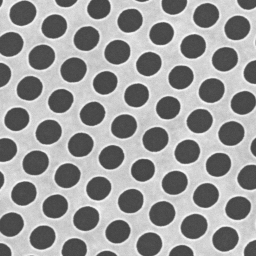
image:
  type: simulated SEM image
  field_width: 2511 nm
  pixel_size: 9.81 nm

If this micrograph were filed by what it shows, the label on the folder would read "a regular array of holes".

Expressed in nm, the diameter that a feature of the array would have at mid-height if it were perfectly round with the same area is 249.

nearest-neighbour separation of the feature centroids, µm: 0.326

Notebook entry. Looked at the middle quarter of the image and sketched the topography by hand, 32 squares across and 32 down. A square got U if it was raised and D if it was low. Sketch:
DDDDDDUUUUUUUUUUUUDDDDDDUUUUDDDU
DDDDDDUUUUUUUUUUUUDDDDDDUUUDDDDD
DDDDDDUUUDDDDUUUUUUDDDDUUUDDDDDD
DDDDDUUUDDDDDUUUUUUUUUUUUUDDDDDD
UDDUUUUDDDDDDUUUUUUUUUUUUUDDDDDD
UUUUUUUDDDDDDUUUDDDDUUUUUUUDDDDU
DUUUUUUUDDDDDUUDDDDDDUUUUUUUUUUU
DDUUUUUUUDDUUUUDDDDDDUUUUUUUUUUU
DDUUUUUUUUUUUUUDDDDDDUUUDDDDUUUU
DDUUUUUDUUUUUUUDDDDDDUUDDDDDDUUU
DDUUUDDDDDUUUUUUDDDDUUUDDDDDDUUU
DUUUDDDDDDUUUUUUUUUUUUUDDDDDDUUU
UUUUDDDDDDUUUUUDUUUUUUUDDDDDDUUD
UUUUDDDDDDUUUDDDDDUUUUUUDDDDUUUD
UUUUUDDDDUUUDDDDDDUUUUUUUUUUUUUD
UUUUUUDUUUUUDDDDDDUUUUUUUUUUUUUD
UUUUUUUUUUUUDDDDDDUUUDDDDUUUUUUD
UUUDDDUUUUUUDDDDDUUUDDDDDDUUUUUU
UUDDDDDUUUUUUUDDUUUUDDDDDDUUUUUU
UDDDDDDUUUUUUUUUUUUUDDDDDDUUUDDD
UDDDDDDUUUUDDDUUUUUUDDDDDDUUDDDD
UDDDDDDUUUDDDDDUUUUUUDDDUUUUDDDD
UUDDDDUUUDDDDDDUUUUUUUUUUUUUDDDD
UUUUUUUUUDDDDDDUUUUUUUUUUUUUDDDD
UUUUUUUUUDDDDDDUUUDDDDUUUUUUUDDD
DDDUUUUUUDDDDDUUUDDDDDDUUUUUUUUU
DDDDUUUUUUUUUUUUUDDDDDDUUUUUUUUU
DDDDUUUUUUUUUUUUUDDDDDDUUUDDDDUU
DDDDUUUDDDDUUUUUUDDDDDUUUDDDDDDU
DDDDUUDDDDDUUUUUUUUDUUUUDDDDDDDU
DDUUUUDDDDDDUUUUUUUUUUUUDDDDDDDU
UUUUUDDDDDDDUUUUDDUUUUUUUDDDDDUU